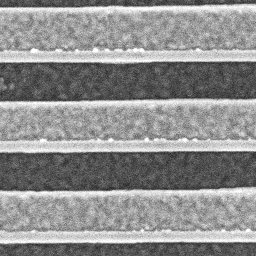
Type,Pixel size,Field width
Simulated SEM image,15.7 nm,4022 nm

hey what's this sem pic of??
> lines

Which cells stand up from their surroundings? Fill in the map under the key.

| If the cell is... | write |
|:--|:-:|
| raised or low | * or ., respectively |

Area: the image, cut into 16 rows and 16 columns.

......**.*******
****************
****************
****************
................
................
****************
****************
****************
................
................
................
****************
****************
****************
................